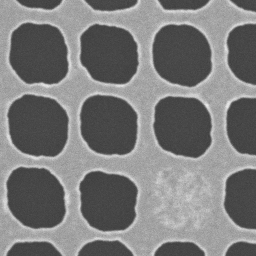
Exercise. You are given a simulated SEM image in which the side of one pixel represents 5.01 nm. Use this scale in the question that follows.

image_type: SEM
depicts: a regular array of holes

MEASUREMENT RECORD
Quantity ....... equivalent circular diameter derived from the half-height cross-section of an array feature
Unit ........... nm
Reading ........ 311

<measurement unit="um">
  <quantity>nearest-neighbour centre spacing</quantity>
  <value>0.355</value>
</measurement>